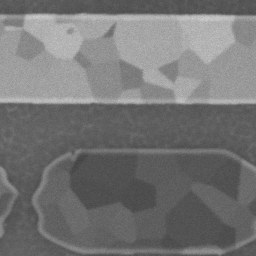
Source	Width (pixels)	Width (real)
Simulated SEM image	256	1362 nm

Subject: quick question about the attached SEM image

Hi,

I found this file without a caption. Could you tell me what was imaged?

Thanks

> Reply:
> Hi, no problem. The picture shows one or a few lines or trenches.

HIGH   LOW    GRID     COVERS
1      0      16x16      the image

0000000000000000
1111111111111111
1111111111111111
1111111111111111
1111111111111111
1111111111111111
0000000000000000
0000000000000000
0000000000000000
0000011111111100
0001111111111111
1001111111111111
1011111111111111
0011111111111111
0001111111111111
0000011111111110